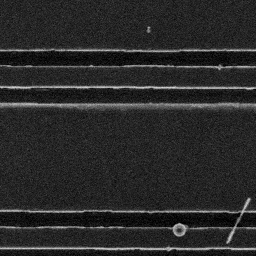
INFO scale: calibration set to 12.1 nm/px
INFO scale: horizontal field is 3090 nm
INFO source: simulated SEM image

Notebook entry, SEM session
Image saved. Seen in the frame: lines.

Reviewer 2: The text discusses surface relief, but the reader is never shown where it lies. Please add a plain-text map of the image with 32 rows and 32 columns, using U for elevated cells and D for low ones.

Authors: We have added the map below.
UUUUUUUUUUUUUUUUUUUUUUUUUUUUUUUU
UUUUUUUUUUUUUUUUUUUUUUUUUUUUUUUU
UUUUUUUUUUUUUUUUUUUUUUUUUUUUUUUU
UUUUUUUUUUUUUUUUUUUUUUUUUUUUUUUU
UUUUUUUUUUUUUUUUUUUUUUUUUUUUUUUU
UUUUUUUUUUUUUUUUUUUUUUUUUUUUUUUU
DDDDDDDDDDDDDDDDDDDDDDDDDDDDDDDD
DDDDDDDDDDDDDDDDDDDDDDDDDDDDDDDD
UUUUUUUUUUUUUUUUUUUUUUUUUUUUUUUU
UUUUUUUUUUUUUUUUUUUUUUUUUUUUUUUU
UUUUUUUUUUUUUUUUUUUUUUUUUUUUUUUU
DDDDDDDDDDDDDDDDDDDDDDDDDDDDDDDD
DDDDDDDDDDDDDDDDDDDDDDDDDDDDDDDD
UUUUUUUUUUUUUUUUUUUUUUUUUUUUUUUU
UUUUUUUUUUUUUUUUUUUUUUUUUUUUUUUU
UUUUUUUUUUUUUUUUUUUUUUUUUUUUUUUU
UUUUUUUUUUUUUUUUUUUUUUUUUUUUUUUU
UUUUUUUUUUUUUUUUUUUUUUUUUUUUUUUU
UUUUUUUUUUUUUUUUUUUUUUUUUUUUUUUU
UUUUUUUUUUUUUUUUUUUUUUUUUUUUUUUU
UUUUUUUUUUUUUUUUUUUUUUUUUUUUUUUU
UUUUUUUUUUUUUUUUUUUUUUUUUUUUUUUU
UUUUUUUUUUUUUUUUUUUUUUUUUUUUUUUU
UUUUUUUUUUUUUUUUUUUUUUUUUUUUUUUU
UUUUUUUUUUUUUUUUUUUUUUUUUUUUUUUU
UUUUUUUUUUUUUUUUUUUUUUUUUUUUUUUU
DDDDDDDDDDDDDDDDDDDDDDDDDDDDDDUD
DDDDDDDDDDDDDDDDDDDDDDDDDDDDDDDD
UUDDUUUUUUUUUUUDDDDDDUUUDDDDDUDD
UUUUUUUUUUUUUUUUUUUUUUUUUUUUUUUU
UUUUUUUUUUUUUUUUUUUUUUUUUUUUUUUU
DDDDDDDDDDDDDDDDDDDDDDDDDDDDDDDD